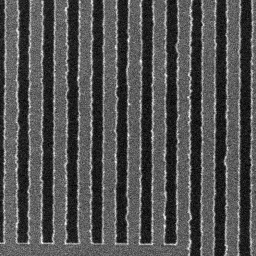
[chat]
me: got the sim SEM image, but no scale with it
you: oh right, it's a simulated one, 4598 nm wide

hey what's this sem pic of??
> parallel lines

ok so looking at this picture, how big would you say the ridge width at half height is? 220 nanometres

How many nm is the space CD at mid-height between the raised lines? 220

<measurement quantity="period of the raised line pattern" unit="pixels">24.7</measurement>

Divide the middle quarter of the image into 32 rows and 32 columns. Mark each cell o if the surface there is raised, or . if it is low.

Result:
.ooo...ooo...ooo...ooo...oooo...
.ooo...ooo...ooo...ooo....ooo...
.ooo...ooo...ooo...ooo...ooo...o
oooo...ooo...ooo...ooo...ooo....
.ooo...ooo...ooo...ooo...ooo...o
.ooo...ooo...ooo...ooo....oo....
.ooo...ooo...ooo...ooo...oooo...
.ooo...ooo...ooo...ooo...oooo...
.ooo...ooo...ooo...ooo...oooo..o
.ooo...ooo...ooo...ooo...ooo....
.ooo...ooo...ooo...ooo...ooo....
.ooo...ooo...ooo...ooo...ooo...o
.ooo...ooo...ooo...ooo...oooo..o
.ooo...ooo...ooo...ooo...oooo..o
.ooo...ooo...ooo...ooo...ooo...o
.ooo...ooo...ooo...ooo...ooo...o
.ooo...ooo...ooo...ooo....oo...o
.ooo...ooo...ooo...ooo...ooo....
.ooo...ooo...ooo...ooo....oo...o
.ooo...ooo...ooo...ooo...oooo...
.ooo...ooo...ooo...ooo...ooo....
oooo...ooo...ooo...ooo...ooo....
oooo...ooo...ooo...ooo...ooo...o
.ooo...ooo...ooo...ooo...ooo...o
.ooo...ooo...ooo...ooo...ooo...o
oooo...ooo...ooo...ooo...ooo...o
oooo...ooo...ooo...ooo...ooo...o
.ooo...ooo...ooo...ooo...ooo...o
.ooo...ooo...ooo...ooo...ooo...o
.ooo...ooo...ooo...ooo...ooo...o
.ooo...ooo...ooo...ooo...ooo...o
.ooo...ooo...ooo...ooo...ooo...o